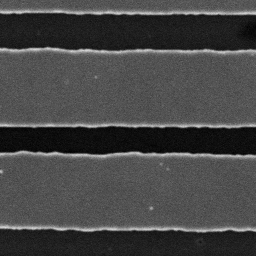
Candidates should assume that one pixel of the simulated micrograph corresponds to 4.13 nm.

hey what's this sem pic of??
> lines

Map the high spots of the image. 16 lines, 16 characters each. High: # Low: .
################
................
................
################
################
################
################
################
................
.#..............
################
################
################
################
................
................